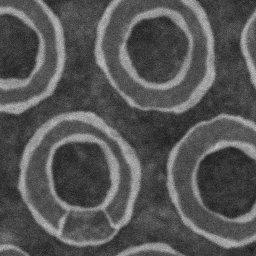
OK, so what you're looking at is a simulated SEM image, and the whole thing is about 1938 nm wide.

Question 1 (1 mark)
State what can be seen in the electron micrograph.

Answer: ring-shaped raised bodies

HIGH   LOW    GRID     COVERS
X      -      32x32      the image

XXXXXX--------XXXXXXXXXX--------
-XXXXX-------XXXXXXXXXXXX-------
---XXXX------XXXX-----XXXX-----X
----XXX------XXX-------XXX-----X
-----XX------XXX--------XX----XX
-----XXX----XXXX--------XX----XX
-----XXX----XXX---------XX-----X
-----XXX----XXXX--------XX-----X
-----XXX-----XXX-------XXX-----X
----XXX------XXXX------XXX------
---XXXX-------XXXX---XXXXX------
XXXXXX---------XXXXXXXXXX-------
XXXXX-----------XXXXXXXX--------
XX---------------XXXXXX---------
----------X----------------XX---
------XXXXXXX------------XXXXXXX
-----XXXXXXXXX----------XXXXXXXX
----XXXX----XXX--------XXXXXXXXX
---XXXX------XXX------XXXXX----X
---XXXX-------XX------XXXX------
---XXX--------XXX----XXXX-------
---XXX--------XXX----XXX--------
---XXX--------XXX----XXX--------
---XXXX-------XXX----XXXX-------
---XXXX-------XXX-----XXX-------
---XXXXX-----XXX------XXX-------
----XXXXXXXXXXXX-------XXXX-----
----XXXXXXXXXXXX-------XXXXXX-XX
------XXXXXXXXX---------XXXXXXXX
-------XXXXXXX------------XXXXXX
-----------------------------XX-
XXX-------------XXXXXX----------